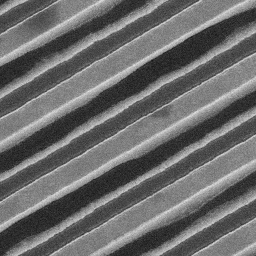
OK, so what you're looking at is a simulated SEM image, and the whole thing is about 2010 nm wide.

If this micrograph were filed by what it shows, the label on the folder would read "lines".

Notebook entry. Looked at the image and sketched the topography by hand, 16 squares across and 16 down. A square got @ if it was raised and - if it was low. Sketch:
-@@@@@----@@@@@-
@@@@----@@@@@---
@@----@@@@@----@
@---@@@@@@---@@@
---@@@@@----@@@@
-@@@@@----@@@@@-
@@@@----@@@@@@--
@@@---@@@@@@---@
@----@@@@@----@@
---@@@@@----@@@@
-@@@@@@---@@@@@-
@@@@@---@@@@@@--
@@@----@@@@@----
@----@@@@@----@@
---@@@@@@---@@@@
--@@@@@----@@@@@